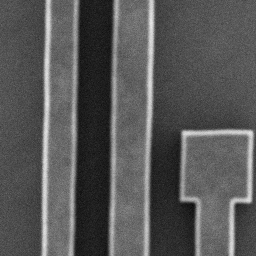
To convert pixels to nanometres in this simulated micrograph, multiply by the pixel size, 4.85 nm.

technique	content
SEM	groups of lines, slits or small figures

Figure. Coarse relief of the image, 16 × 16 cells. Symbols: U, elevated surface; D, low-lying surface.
DDDUUDDUUDDDDDDD
DDDUUDDUUDDDDDDD
DDDUUDDUUDDDDDDD
DDDUUDDUUDDDDDDD
DDDUUDDUUDDDDDDD
DDDUUDDUUDDDDDDD
DDDUUDDUUDDDDDDD
DDDUUDDUUDDDDDDD
DDDUUDDUUDDDUUUU
DDDUUDDUUDDUUUUU
DDDUUDDUUDDUUUUU
DDDUUDDUUDDUUUUU
DDDUUDDUUDDDUUUD
DDDUUDDUUDDDUUUD
DDDUUDDUUDDDUUDD
DDDUUDDUUDDDUUDD